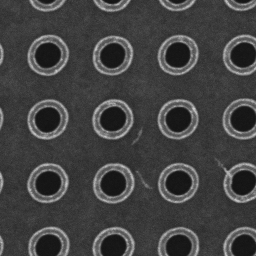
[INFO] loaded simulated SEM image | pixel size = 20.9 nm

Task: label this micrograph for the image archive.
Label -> a regular array of ring-shaped raised bodies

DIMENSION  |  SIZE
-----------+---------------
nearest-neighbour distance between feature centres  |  63.6 px